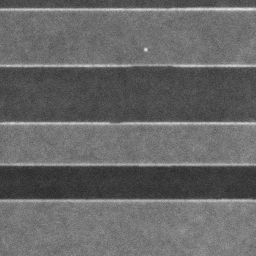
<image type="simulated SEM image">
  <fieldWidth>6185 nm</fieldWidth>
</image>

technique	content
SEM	lines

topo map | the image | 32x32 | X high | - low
--------------------------------
XXXXXXXXXXXXXXXXXXXXXXXXXXXXXXXX
XXXXXXXXXXXXXXXXXXXXXXXXXXXXXXXX
XXXXXXXXXXXXXXXXXXXXXXXXXXXXXXXX
XXXXXXXXXXXXXXXXXXXXXXXXXXXXXXXX
XXXXXXXXXXXXXXXXXXXXXXXXXXXXXXXX
XXXXXXXXXXXXXXXXXXXXXXXXXXXXXXXX
XXXXXXXXXXXXXXXXXXXXXXXXXXXXXXXX
--------------------------------
--------------------------------
--------------------------------
--------------------------------
--------------------------------
--------------------------------
--------------------------------
XXXXXXXXXXXXXXXXXXXXXXXXXXXXXXXX
XXXXXXXXXXXXXXXXXXXXXXXXXXXXXXXX
XXXXXXXXXXXXXXXXXXXXXXXXXXXXXXXX
XXXXXXXXXXXXXXXXXXXXXXXXXXXXXXXX
XXXXXXXXXXXXXXXXXXXXXXXXXXXXXXXX
XXXXXXXXXXXXXXXXXXXXXXXXXXXXXXXX
--------------------------------
--------------------------------
--------------------------------
--------------------------------
XXXXXXXXXXXXXXXXXXXXXXXXXXXXXXXX
XXXXXXXXXXXXXXXXXXXXXXXXXXXXXXXX
XXXXXXXXXXXXXXXXXXXXXXXXXXXXXXXX
XXXXXXXXXXXXXXXXXXXXXXXXXXXXXXXX
XXXXXXXXXXXXXXXXXXXXXXXXXXXXXXXX
XXXXXXXXXXXXXXXXXXXXXXXXXXXXXXXX
XXXXXXXXXXXXXXXXXXXXXXXXXXXXXXXX